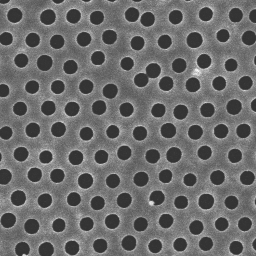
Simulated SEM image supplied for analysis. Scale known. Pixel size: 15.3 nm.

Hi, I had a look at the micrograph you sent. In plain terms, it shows a regular array of holes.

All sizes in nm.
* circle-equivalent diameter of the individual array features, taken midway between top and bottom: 224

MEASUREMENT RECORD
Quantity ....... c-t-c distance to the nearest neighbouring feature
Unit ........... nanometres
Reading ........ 358